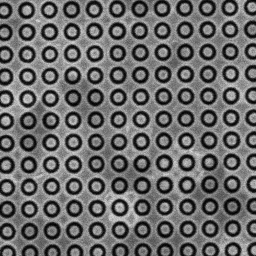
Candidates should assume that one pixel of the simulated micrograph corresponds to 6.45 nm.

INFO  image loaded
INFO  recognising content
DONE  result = a regular array of ring-shaped grooves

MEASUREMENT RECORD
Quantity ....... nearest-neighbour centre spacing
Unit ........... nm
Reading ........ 141